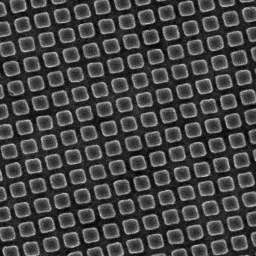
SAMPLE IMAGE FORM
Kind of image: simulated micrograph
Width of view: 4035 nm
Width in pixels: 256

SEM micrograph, a regular array of raised bodies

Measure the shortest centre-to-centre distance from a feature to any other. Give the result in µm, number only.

0.314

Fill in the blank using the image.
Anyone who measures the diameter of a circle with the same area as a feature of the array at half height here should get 252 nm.